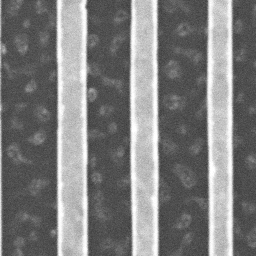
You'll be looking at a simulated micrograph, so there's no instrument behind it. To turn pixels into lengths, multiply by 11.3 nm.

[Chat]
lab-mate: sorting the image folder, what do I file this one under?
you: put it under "one or a few lines or trenches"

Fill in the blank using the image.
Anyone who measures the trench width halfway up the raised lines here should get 0.586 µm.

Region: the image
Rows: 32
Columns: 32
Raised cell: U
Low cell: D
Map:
DDDDDDDUUUUDDDDDDUUDDDDDDDUUUDDD
DDDDDDDUUUUDDDDDDUUDDDDDDDUUUDDD
DDDDDDDUUUUDDDDDDUUDDDDDDDUUUDDD
DDDDDDDUUUUDDDDDDUUDDDDDDDUUUDDD
DDDDDDDUUUUDDDDDDUUDDDDDDDUUUDDD
DDDDDDDUUUUDDDDDDUUDDDDDDDUUUDDD
DDDDDDDUUUUDDDDDDUUDDDDDDDUUUDDD
DDDDDDDUUUUDDDDDDUUDDDDDDDUUUDDD
DDDDDDDUUUUDDDDDDUUDDDDDDDUUUDDD
DDDDDDDUUUDDDDDDDUUDDDDDDDUUUDDD
DDDDDDDUUUDDDDDDDUUDDDDDDDUUUDDD
DDDDDDDUUUUDDDDDDUUDDDDDDDUUUDDD
DDDDDDDUUUUDDDDDDUUDDDDDDDUUUDDD
DDDDDDDUUUUDDDDDDUUDDDDDDDUUUDDD
DDDDDDDUUUUDDDDDDUUDDDDDDDUUUDDD
DDDDDDDUUUUDDDDDDUUDDDDDDDUUUDDD
DDDDDDDUUUUDDDDDDUUDDDDDDDUUUDDD
DDDDDDDUUUUDDDDDDUUDDDDDDDUUUDDD
DDDDDDDUUUUDDDDDDUUDDDDDDDUUUDDD
DDDDDDDUUUUDDDDDDUUUDDDDDDUUUDDD
DDDDDDDUUUUDDDDDDUUUDDDDDDUUUDDD
DDDDDDDUUUUDDDDDDUUUDDDDDDUUUDDD
DDDDDDDUUUUDDDDDDUUUDDDDDDUUUDDD
DDDDDDDUUUUDDDDDDUUUDDDDDDUUUDDD
DDDDDDDUUUUDDDDDDUUUDDDDDDUUUDDD
DDDDDDDUUUUDDDDDDUUDDDDDDDUUUDDD
DDDDDDDDUUUDDDDDDUUDDDDDDDUUUDDD
DDDDDDDDUUUDDDDDDUUDDDDDDDUUUDDD
DDDDDDDDUUUDDDDDDUUDDDDDDDUUUDDD
DDDDDDDDUUUDDDDDDUUDDDDDDDUUUDDD
DDDDDDDDUUUDDDDDDUUDDDDDDDUUUDDD
DDDDDDDDUUUDDDDDDUUDDDDDDDUUUDDD